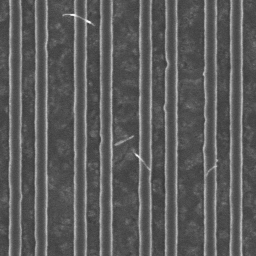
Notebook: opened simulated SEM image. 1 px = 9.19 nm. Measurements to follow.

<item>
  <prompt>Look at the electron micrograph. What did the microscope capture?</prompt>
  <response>parallel lines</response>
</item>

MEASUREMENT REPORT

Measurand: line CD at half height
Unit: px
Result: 11.8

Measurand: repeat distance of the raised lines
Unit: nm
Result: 290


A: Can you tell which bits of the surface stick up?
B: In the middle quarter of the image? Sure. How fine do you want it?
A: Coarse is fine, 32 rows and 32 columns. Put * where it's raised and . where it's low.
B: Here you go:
...**....***.......***....**....
...**....***.......***...***....
...**....***.......***...***....
...**....***.......***...***....
...***...***.......***...***....
...***...***.......***...***....
...***...***.......***...***....
...**....***.......***...***....
...***...***.......***...***....
...***...***.......***...***....
...***...***.......***...***....
...**....***.......***...***....
...**....***.......***...***....
...**....***.......***...***....
...**....***.......***...***....
...***...***.......***...***....
...**....***.......***...***....
...**....***.......***...***....
...***...***.......***...***....
...***...***.......***...***....
...***...***.......***...***....
...**....***.......***....**....
...**....***.......***...***....
...**....***.......***...***....
...**....***.......***...***....
...**....***.......***...***....
...**....***.......***...***....
...**....***.......***...***....
...**....***.......**....***....
...***...***.......**....***....
...***...***.......***...***....
...**....***.......***....**....